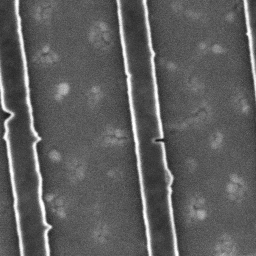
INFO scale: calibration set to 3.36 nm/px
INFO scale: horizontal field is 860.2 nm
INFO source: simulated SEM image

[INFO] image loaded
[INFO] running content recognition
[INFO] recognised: one or a few lines or trenches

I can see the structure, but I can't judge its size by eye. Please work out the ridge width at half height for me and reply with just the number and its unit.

0.0897 µm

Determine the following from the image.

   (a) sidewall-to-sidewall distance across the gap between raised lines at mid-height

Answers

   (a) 333 nm